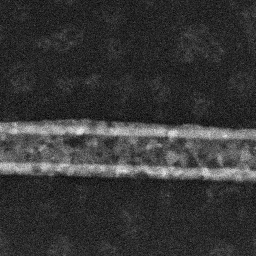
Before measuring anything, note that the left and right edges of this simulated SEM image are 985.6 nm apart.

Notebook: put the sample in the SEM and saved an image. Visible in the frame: one or a few lines or trenches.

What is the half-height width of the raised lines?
144 nm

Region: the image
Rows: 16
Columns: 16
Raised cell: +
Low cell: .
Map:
................
................
................
................
................
................
................
................
+++++++++++++++.
++++++++++++++++
......++++++++++
................
................
................
................
................